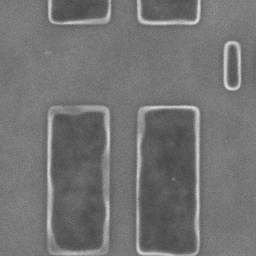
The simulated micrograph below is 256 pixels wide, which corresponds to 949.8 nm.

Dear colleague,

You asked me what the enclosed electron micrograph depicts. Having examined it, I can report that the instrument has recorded wiring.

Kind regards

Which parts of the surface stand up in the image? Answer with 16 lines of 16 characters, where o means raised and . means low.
...oooo..ooo....
................
................
..............o.
..............o.
................
................
...oooo..ooo....
...oooo..ooo....
...oooo..ooo....
...oooo..ooo....
...oooo..ooo....
...oooo..ooo....
...oooo..ooo....
...oooo..ooo....
...ooo...ooo....